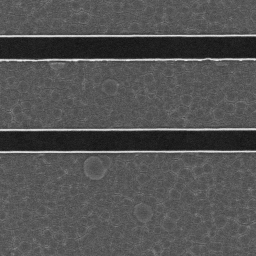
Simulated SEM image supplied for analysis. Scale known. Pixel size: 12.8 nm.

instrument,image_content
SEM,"one or a few lines or trenches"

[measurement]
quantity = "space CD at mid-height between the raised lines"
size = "890 nanometres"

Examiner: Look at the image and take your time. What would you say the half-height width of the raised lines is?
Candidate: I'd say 298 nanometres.